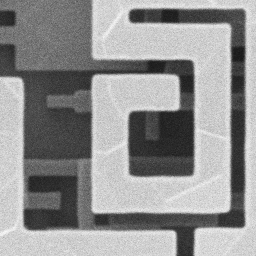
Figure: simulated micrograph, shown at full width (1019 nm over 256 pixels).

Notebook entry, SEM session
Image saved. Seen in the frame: wiring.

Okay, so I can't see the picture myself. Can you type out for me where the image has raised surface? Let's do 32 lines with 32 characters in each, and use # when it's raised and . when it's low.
............####################
............####...............#
............####...............#
............#################..#
............#################..#
............#################..#
............#################..#
........................#####..#
........................#####..#
............##########..#####..#
###.........##########..#####..#
###.........##########..#####..#
###.........##########..#####..#
###.........##########..#####..#
###.........####........#####..#
###.........####........#####..#
###.........####........#####..#
###.........####........#####..#
###.........####........#####..#
###.........####........#####..#
###.........####........#####..#
###.........####........#####..#
###.........#################..#
###.........#################..#
###.........#################..#
###.........#################..#
###.........#####.##########...#
###............................#
###...........................##
######################..########
######################..########
######################..########